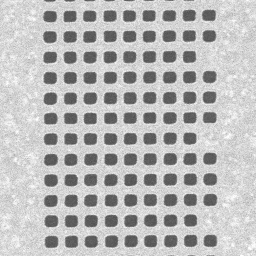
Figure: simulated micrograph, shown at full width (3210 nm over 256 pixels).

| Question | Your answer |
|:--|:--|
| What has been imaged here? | a regular array of holes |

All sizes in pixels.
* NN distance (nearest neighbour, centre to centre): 19.7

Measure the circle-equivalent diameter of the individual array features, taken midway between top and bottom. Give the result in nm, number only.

173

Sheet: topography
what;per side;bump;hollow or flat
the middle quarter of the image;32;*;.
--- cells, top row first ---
********************************
********************************
...**...**...**...**...**...**..
...**...**...**...**...**...**..
...**...**...**...**...**...**..
********************************
********************************
...**...**...**...**...**...**..
...**...**...**...**...**...**..
...**...**...**...**...**...**..
********************************
********************************
...**...**...**...**...**...**..
...**...**...**...**...**...**..
...**...**...**...**...**...**..
********************************
********************************
...**...**...**...**...**...**..
...**...**...**...**...**...**..
...**...**...**...**...**...**..
********************************
********************************
*..***..**...***..**...**...**..
....*...**....*...**...**...**..
...**...**...**...**...**...**..
*.**************.***************
********************************
*.****..***..***..***..**...**..
....*...**....*...**...**...**..
....*...**...**...**...**...**..
...***..***.****.****.****.*****
********************************